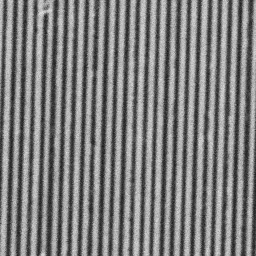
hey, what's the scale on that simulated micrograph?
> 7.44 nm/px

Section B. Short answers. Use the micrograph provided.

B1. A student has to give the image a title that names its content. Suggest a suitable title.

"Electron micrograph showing parallel lines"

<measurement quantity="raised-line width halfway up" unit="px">4.5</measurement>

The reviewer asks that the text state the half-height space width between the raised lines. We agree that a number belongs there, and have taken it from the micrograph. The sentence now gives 40 nanometres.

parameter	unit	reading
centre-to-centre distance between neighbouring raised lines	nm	76.1